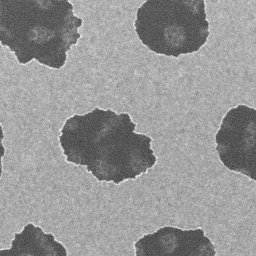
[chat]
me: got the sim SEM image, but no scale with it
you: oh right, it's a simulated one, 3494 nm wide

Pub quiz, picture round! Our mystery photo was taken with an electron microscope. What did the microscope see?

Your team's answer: holes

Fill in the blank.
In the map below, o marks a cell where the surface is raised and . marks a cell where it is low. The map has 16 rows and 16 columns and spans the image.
.....oooo....ooo
.....ooo.....ooo
.....oooo....ooo
o...oooooooooooo
oooooooooooooooo
oooooooooooooooo
oooooooooooooooo
oooo....oooooo..
oooo.....ooooo..
oooo......oooo..
ooooo....ooooo..
oooooooooooooooo
oooooooooooooooo
oooooooooooooooo
o..ooooooo...ooo
....oooo.....ooo